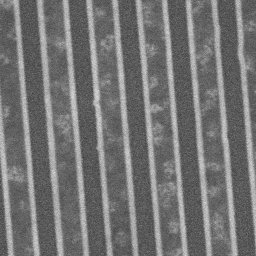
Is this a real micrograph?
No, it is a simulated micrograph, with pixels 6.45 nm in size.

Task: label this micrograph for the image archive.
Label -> parallel lines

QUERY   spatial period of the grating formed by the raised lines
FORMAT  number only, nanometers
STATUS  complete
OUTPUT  318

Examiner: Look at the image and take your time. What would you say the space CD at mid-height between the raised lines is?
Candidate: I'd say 150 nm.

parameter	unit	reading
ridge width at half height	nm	166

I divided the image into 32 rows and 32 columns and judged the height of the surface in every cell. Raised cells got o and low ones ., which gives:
oo...ooo...ooo...oooo...ooo...oo
oo...ooo...ooo...oooo...ooo...oo
oo...ooo...oooo..oooo...ooo...oo
oo...ooo...oooo...ooo...ooo...oo
oo...ooo....ooo...ooo...ooo...oo
oo...oooo...ooo...ooo...ooo...oo
ooo..oooo...ooo...ooo...ooo...oo
ooo...ooo...ooo...ooo...ooo...oo
ooo...ooo...ooo...ooo...ooo...oo
ooo...ooo...ooo...ooo...ooo....o
ooo...ooo...ooo...ooo...oooo...o
ooo...ooo...ooo...oooo..oooo...o
ooo...ooo...ooo...oooo...ooo...o
ooo...ooo...ooo...oooo...ooo...o
ooo...ooo...oooo..oooo...ooo...o
ooo...ooo...oooo...ooo...ooo...o
ooo...oooo...ooo...ooo...ooo...o
ooo...oooo...ooo...ooo...ooo...o
ooo...oooo...ooo...ooo...ooo...o
oooo...ooo...ooo...ooo...ooo...o
oooo...ooo...ooo...ooo...ooo...o
.ooo...ooo...ooo...ooo...oooo...
.ooo...ooo...ooo...ooo...oooo...
.ooo...ooo...ooo...ooo...oooo...
.ooo...ooo...ooo...ooo....ooo...
.ooo...ooo...ooo...oooo...ooo...
.ooo...ooo...oooo...ooo...ooo...
.ooo...ooo...oooo...ooo...ooo...
.ooo...ooo...oooo...ooo...ooo...
.ooo...oooo...ooo...ooo...ooo...
.ooo...oooo...ooo...ooo...ooo...
.oooo...ooo...ooo...ooo...ooo...